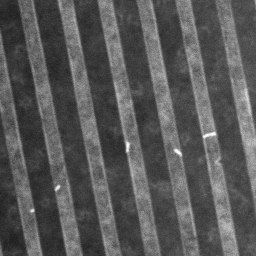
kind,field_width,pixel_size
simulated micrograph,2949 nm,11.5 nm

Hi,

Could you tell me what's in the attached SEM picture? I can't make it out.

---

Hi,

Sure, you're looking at parallel lines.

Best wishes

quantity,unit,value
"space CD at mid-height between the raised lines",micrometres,0.148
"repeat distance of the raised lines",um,0.446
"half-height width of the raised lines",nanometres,296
